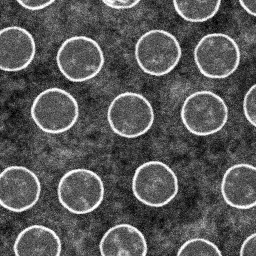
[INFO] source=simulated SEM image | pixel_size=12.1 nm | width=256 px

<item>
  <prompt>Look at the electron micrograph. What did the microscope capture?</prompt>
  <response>a regular array of raised bodies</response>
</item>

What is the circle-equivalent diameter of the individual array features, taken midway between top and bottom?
527 nm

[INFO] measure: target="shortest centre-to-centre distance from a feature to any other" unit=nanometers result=718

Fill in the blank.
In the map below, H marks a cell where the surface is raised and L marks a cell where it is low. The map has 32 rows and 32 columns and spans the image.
LLLHHHLLLLLLLHHHHLLLLLHHHHHLLLHH
LLLLLLLLLLLLLLLLLLLLLLHHHHHLLLLH
LLLLLLLLLLLLLLLLLLLLLLLLHLLLLLLL
LLLLLLLLLLLLLLLLLLLLLLLLLLLLLLLL
HHHHLLLLLLLLLLLLLLHHHLLLLLHHLLLL
HHHHLLLLHHHHLLLLLHHHHHLLLHHHHLLL
HHHHLLLHHHHHHLLLLHHHHHLLHHHHHHLL
HHHHLLLHHHHHHLLLLHHHHHLLHHHHHHLL
HHHLLLLLHHHHLLLLLLHHHLLLLHHHHLLL
LLLLLLLLHHHHLLLLLLLLLLLLLLHHLLLL
LLLLLLLLLLLLLLLLLLLLLLLLLLLLLLLL
LLLLLLHHLLLLLLLLLLLLLLLLLLLLLLLH
LLLLLHHHHLLLLLHHHHLLLLLHHHHHLLLH
LLLLHHHHHHLLLLHHHHHLLLLHHHHHLLLH
LLLLHHHHHHLLLLHHHHHLLLLHHHHHLLLH
LLLLLHHHHLLLLLHHHHHLLLLHHHHHLLLL
LLLLLLLLLLLLLLLHHHLLLLLLHHHLLLLL
LLLLLLLLLLLLLLLLLLLLLLLLLLLLLLLL
LLLLLLLLLLLLLLLLLLLLLLLLLLLLLLLL
LLLLLLLLLLLLLLLLLLLLLLLLLLLLLLLL
LLLLLLLLLLLLLLLLLLHHLLLLLLLLLLLL
LHHHLLLLLHHLLLLLLHHHHLLLLLLLHHHH
HHHHHLLLHHHHLLLLLHHHHHLLLLLLHHHH
HHHHHLLHHHHHHLLLLHHHHHLLLLLLHHHH
HHHHHLLHHHHHHLLLLHHHHHLLLLLLHHHH
HHHHLLLLHHHHLLLLLLLHLLLLLLLLLHHH
LLLLLLLLLHHLLLLLLLLLLLLLLLLLLLLL
LLLLLLLLLLLLLLLLLLLLLLLLLLLLLLLL
LLLLHHLLLLLLLLHHHLLLLLLLLLLLLLLL
LLHHHHHLLLLLLHHHHHLLLLLLLLLLLLLL
LLHHHHHLLLLLLHHHHHLLLLLHHHLLLLLH
LLHHHHHLLLLLLHHHHHLLLLHHHHHLLLHH